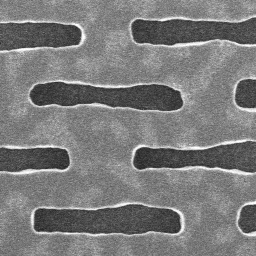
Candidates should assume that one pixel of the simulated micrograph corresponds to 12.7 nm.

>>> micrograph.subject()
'holes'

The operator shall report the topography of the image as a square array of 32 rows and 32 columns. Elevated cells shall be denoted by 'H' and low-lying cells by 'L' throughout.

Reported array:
HHHHHHHHHHHHHHHHHHHHHHHHHHHHHHHH
HHHHHHHHHHHHHHHHHHHHHHHHHHHHHHHH
HHHHHHHHHHHHHHHHHLHHHLLLHHHHHHHL
LLLLLLLLLLHHHHHHLLLLLLLLLLLLLLLL
LLLLLLLLLLHHHHHHHLLLLLLLLLLLLLLL
LLLLLLLLLLHHHHHHHHHLLLLHHHHHHHLL
HHHHHHHHHHHHHHHHHHHHHHHHHHHHHHHH
HHHHHHHHHHHHHHHHHHHHHHHHHHHHHHHH
HHHHHHHHHHHHHHHHHHHHHHHHHHHHHHHH
HHHHHHHHHHHHHHHHHHHHHHHHHHHHHHHH
HHHHHLLLLLLHHHHHHHLLHHHHHHHHHHLL
HHHHLLLLLLLLLLLLLLLLLLHHHHHHHLLL
HHHHLLLLLLLLLLLLLLLLLLLHHHHHHLLL
HHHHHHHHHHHHHHHHLLLLLLLHHHHHHHLL
HHHHHHHHHHHHHHHHHHHHHHHHHHHHHHHH
HHHHHHHHHHHHHHHHHHHHHHHHHHHHHHHH
HHHHHHHHHHHHHHHHHHHHHHHHHHHHHHHH
HHHHHHHHHHHHHHHHHHHHHHHHHHHHHHHH
LLLHLLLHHHHHHHHHHLLHLHHHHHLLLLLL
LLLLLLLLLHHHHHHHHLLLLLLLLLLLLLLL
LLLLLLLLLHHHHHHHHLLLLLLLLLLLLLLL
HLLHHHHHHHHHHHHHHHHHHHHHHHHHHLLL
HHHHHHHHHHHHHHHHHHHHHHHHHHHHHHHH
HHHHHHHHHHHHHHHHHHHHHHHHHHHHHHHH
HHHHHHHHHHHHHHHHHHHHHHHHHHHHHHHH
HHHHHHHHHHHHHHHHLHHHHHHHHHHHHHHH
HHHHLLLLLLLLLLLLLLLLLLHHHHHHHHLL
HHHHLLLLLLLLLLLLLLLLLLLHHHHHHHLL
HHHHLLLLLLLLLLLLLLLLLLLHHHHHHHLL
HHHHHHHHHHHHHHHHHHHHHHHHHHHHHHHH
HHHHHHHHHHHHHHHHHHHHHHHHHHHHHHHH
HHHHHHHHHHHHHHHHHHHHHHHHHHHHHHHH